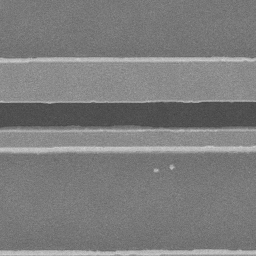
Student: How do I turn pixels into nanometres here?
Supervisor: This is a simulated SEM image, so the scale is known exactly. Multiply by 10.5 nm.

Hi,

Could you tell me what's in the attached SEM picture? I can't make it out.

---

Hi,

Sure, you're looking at lines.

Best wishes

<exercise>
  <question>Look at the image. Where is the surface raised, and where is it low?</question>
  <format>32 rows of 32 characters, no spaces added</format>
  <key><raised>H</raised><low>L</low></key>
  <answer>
LLLLLLLLLLLLLLLLLLLLLLLLLLLLLLLL
LLLLLLLLLLLLLLLLLLLLLLLLLLLLLLLL
LLLLLLLLLLLLLLLLLLLLLLLLLLLLLLLL
LLLLLLLLLLLLLLLLLLLLLLLLLLLLLLLL
LLLLLLLLLLLLLLLLLLLLLLLLLLLLLLLL
LLLLLLLLLLLLLLLLLLLLLLLLLLLLLLLL
LLLLLLLLLLLLLLLLLLLLLLLLLLLLLLLL
LLLLLLLLLLLLLLLLLLLLLLLLLLLHLLLL
HHHHHHHHHHHHHHHHHHHHHHHHHHHHHHHH
HHHHHHHHHHHHHHHHHHHHHHHHHHHHHHHH
HHHHHHHHHHHHHHHHHHHHHHHHHHHHHHHH
HHHHHHHHHHHHHHHHHHHHHHHHHHHHHHHH
HHHHHHHHHHHHHHHHHHHHHHHHHHHHHHHH
LLLLLLLLLLLLLLLLLLLLLLLLLLLLLLLL
LLLLLLLLLLLLLLLLLLLLLLLLLLLLLLLL
LLLLLLLLLLLLLLLLLLLLLLLLLLLLLLLL
HHHHHHHHHHHHHHHHHHHHHHHHHHHHHHHH
HHHHHHHHHHHHHHHHHHHHHHHHHHHHHHHH
HHHHHHHHHHHHHHHHHHHLHLLHHLLLLHLL
LLLLLLLLLLLLLLLLLLLLLLLLLLLLLLLL
LLLLLLLLLLLLLLLLLLLLLLLLLLLLLLLL
LLLLLLLLLLLLLLLLLLLLLLLLLLLLLLLL
LLLLLLLLLLLLLLLLLLLLLLLLLLLLLLLL
LLLLLLLLLLLLLLLLLLLLLLLLLLLLLLLL
LLLLLLLLLLLLLLLLLLLLLLLLLLLLLLLL
LLLLLLLLLLLLLLLLLLLLLLLLLLLLLLLL
LLLLLLLLLLLLLLLLLLLLLLLLLLLLLLLL
LLLLLLLLLLLLLLLLLLLLLLLLLLLLLLLL
LLLLLLLLLLLLLLLLLLLLLLLLLLLLLLLL
LLLLLLLLLLLLLLLLLLLLLLLLLLLLLLLL
LLLLLLLLLLLLLLLLLLLLLLLLLLLLLLLL
LLLLLLLLLLLLLLLLLLLLLLLLLLLLLLLL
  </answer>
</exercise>